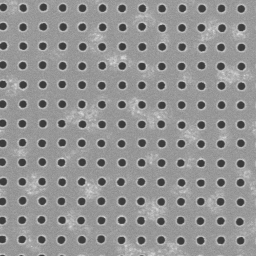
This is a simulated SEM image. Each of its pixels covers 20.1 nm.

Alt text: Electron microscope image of a regular array of holes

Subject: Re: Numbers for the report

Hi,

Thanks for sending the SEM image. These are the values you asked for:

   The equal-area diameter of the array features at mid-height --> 157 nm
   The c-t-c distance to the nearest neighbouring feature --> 0.379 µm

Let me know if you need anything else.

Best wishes